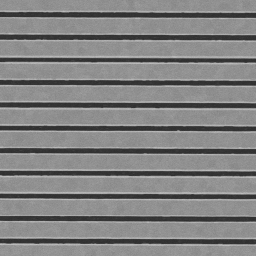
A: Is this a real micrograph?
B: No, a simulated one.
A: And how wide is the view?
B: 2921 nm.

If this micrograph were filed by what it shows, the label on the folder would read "parallel lines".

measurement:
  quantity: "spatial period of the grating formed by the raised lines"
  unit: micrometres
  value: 0.259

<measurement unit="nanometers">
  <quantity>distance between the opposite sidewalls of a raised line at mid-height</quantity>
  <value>191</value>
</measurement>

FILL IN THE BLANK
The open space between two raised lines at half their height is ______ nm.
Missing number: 64.2